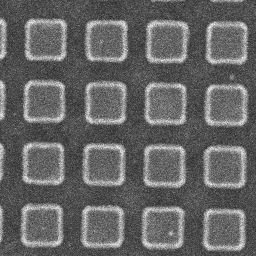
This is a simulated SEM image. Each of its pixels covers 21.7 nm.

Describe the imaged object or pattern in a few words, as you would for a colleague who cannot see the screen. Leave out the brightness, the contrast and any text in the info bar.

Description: a regular array of raised bodies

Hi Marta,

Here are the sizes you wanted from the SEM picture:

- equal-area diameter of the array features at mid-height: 931 nm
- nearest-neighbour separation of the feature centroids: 1310 nanometers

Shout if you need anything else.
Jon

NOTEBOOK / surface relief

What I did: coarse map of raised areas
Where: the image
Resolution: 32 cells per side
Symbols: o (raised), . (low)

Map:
................................
................................
................................
o..ooooo...ooooo...oooo...ooooo.
o..ooooo...ooooo...oooo...ooooo.
...ooooo...ooooo...oooo...ooooo.
...ooooo...ooooo...oooo...ooooo.
...................oooo...oooo..
................................
................................
....oooo....ooo.................
...ooooo...ooooo..ooooo...ooooo.
...ooooo...ooooo..ooooo...ooooo.
...ooooo...ooooo..ooooo...ooooo.
...ooooo...oooo...ooooo...ooooo.
.............................o..
................................
................................
...ooooo...oooo....ooo....oo....
...ooooo...oooo...ooooo...ooooo.
...ooooo...oooo...ooooo...ooooo.
...ooooo...oooo...ooooo...ooooo.
...oooo....oooo...ooooo...oooo..
................................
................................
................................
...ooooo...oooo...ooooo...oooo..
...ooooo...oooo...ooooo...oooo..
...ooooo..ooooo...ooooo...oooo..
...ooooo..ooooo...ooooo...oooo..
...oooo....oooo...ooooo...oooo..
................................